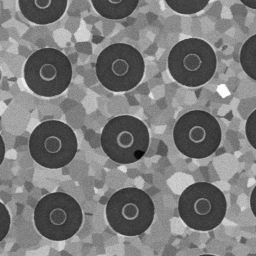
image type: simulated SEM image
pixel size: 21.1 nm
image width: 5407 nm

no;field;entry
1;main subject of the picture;an array of small figures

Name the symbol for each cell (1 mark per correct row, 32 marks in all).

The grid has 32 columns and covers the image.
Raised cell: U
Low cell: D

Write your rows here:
UUDDDUDDUUUDDDDDDUUUUDDDDDUUUUDD
UUDDDDDDUUUUDDDDDUUUUUDDDUUUUUUU
UUUDDDDUUUUUUUUUUUUUUUUUUUUUUUUU
UUUUUUUUUUUUUUUUUUUUUUUUUUUUUUUU
UUUUUUUUUUUUUUUUUUUUUUUUUUUUUUUD
UUUUUUUUUUUUUUDDUUUUUUDDDDUUUUDD
UUUUDDDDUUUUUDDDDUUUUDDDDDDUUUDD
UUUDDDDDDUUUDDDDDDUUUDDUUDDUUUDD
UUUDDUUDDUUUDDUUDDUUUDDUUDDUUUDD
UUUDDUUDDUUUDDDDDDUUUDDDDDDUUUUD
UUUDDDDDDUUUUDDDDUUUUUDDDDUUUUUU
UUUUDDDDUUUUUUDDUUUUUUUUUUUUUUUU
UUUUUUUUUUUUUUUUUUUUUUUUUUUUUUUU
UUUUUUUUUUUUUUUUUUUUUUUUUUUUUUUU
UUUUUUUUUUUUUUUDDUUUUUUDDDDUUUUD
UUUUUDDDUUUUUDDDDDUUUUDDDDDUUUUD
UUUUDDDDDUUUUDDDDDDUUUDDUUDDUUUD
UUUUDDUDDDUUUDDUUDDUUUDDUDDDUUUD
DUUUDDUDDDUUUDDDDDDUUUDDDDDUUUUU
DUUUDDDDDUUUUDDDDDUUUUUDDDUUUUUU
UUUUUDDDDUUUUUUDUUUUUUUUUUUUUUUU
UUUUUUUUUUUUUUUUUUUUUUUUUUUUUUUU
UUUUUUUUUUUUUUUUUUUUUUUUUUUUUUUU
UUUUUUUUUUUUUUUUDUUUUUUDDDDUUUUU
UUUUUUDDDUUUUUDDDDDUUUUDDDDDUUUD
DUUUUDDDDDUUUDDDDDDUUUDDUUDDUUUD
DUUUDDDUDDUUUDDUUDDUUUDDDUDDUUUU
DUUUDDUUDDUUUDDDDDDUUUUDDDDDUUUU
DUUUDDDDDDUUUUDDDDDUUUUUDDDUUUUU
DUUUUDDDDUUUUUUDDUUUUUUUUUUUUUUU
UUUUUUUUUUUUUUUUUUUUUUUUUUUUUUUU
UUUUUUUUUUUUUUUUUUUUUUUUUUUUUUUU